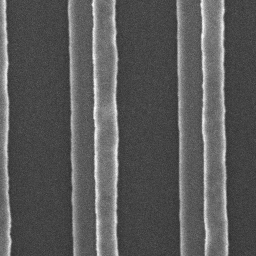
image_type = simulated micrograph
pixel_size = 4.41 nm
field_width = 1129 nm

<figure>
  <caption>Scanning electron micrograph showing lines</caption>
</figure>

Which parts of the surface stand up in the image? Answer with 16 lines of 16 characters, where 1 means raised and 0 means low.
0000111000011100
0000111000011100
0000111000011100
0000111000011100
0000111000011100
0000111000011100
0000111000011100
0000111000011100
0000011000011100
0000011000011100
0000011000011100
0000011000011100
1000011000011100
1000011000011100
1000011000011100
1000011000011100